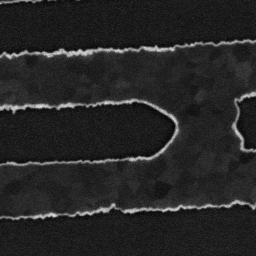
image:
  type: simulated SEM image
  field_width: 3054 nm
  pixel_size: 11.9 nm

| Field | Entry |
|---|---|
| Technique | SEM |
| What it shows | one or a few lines or trenches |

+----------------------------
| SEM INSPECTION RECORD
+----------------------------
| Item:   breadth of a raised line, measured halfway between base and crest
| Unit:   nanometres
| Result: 646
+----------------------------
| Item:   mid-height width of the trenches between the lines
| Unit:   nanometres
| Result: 657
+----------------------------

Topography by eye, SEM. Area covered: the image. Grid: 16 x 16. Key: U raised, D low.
DDDDDDDDDDDDDDDD
DDDDDDDDDDDDDDDD
DDDDDDDDDDDDDDDD
UUUUUUUUUUUUUUUU
UUUUUUUUUUUUUUUU
UUUUUUUUUUUUUUUU
UUUUUUDDDUUUUUUD
DDDDDDDDDDDUUUUD
DDDDDDDDDDDUUUUD
DDDDDDDDDDUUUUUU
UUUUUUUUUUUUUUUU
UUUUUUUUUUUUUUUU
UUUUUUUUUUUUUUUU
UUUDDDDDDDDDDDDD
DDDDDDDDDDDDDDDD
DDDDDDDDDDDDDDDD